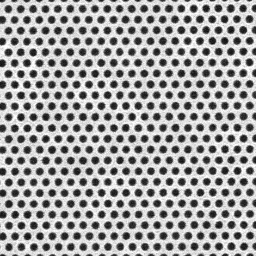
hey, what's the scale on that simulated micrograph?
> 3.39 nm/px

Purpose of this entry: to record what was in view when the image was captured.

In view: a regular array of holes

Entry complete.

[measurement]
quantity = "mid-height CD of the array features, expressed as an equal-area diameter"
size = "27.9 nm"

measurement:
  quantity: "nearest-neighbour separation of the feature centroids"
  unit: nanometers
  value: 41.3